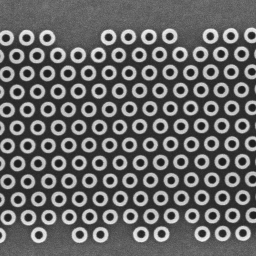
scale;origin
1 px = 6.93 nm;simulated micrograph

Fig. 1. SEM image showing a regular array of ring-shaped raised bodies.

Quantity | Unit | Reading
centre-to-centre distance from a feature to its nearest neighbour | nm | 139